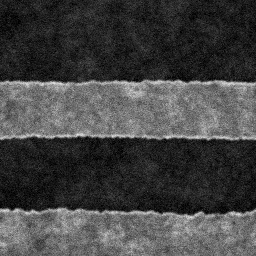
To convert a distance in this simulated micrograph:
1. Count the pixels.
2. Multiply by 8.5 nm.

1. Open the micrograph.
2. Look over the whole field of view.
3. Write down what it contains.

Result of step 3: one or a few lines or trenches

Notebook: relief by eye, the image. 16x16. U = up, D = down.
DDDDDDDDDDDDDDDD
DDDDDDDDDDDDDDDD
DDDDDDDDDDDDDDDD
DDDDDDDDDDDDDDDD
DDDDDDDDDDDDDDDD
UUUUUUUUUUUUUUUU
UUUUUUUUUUUUUUUU
UUUUUUUUUUUUUUUU
UUUUDDUUUUUUUUUU
DDDDDDDDDDDDDDDD
DDDDDDDDDDDDDDDD
DDDDDDDDDDDDDDDD
DDDDDDDDDDDDDDDD
UUUUUUUUUUUDUUUU
UUUUUUUUUUUUUUUU
UUUUUUUUUUUUUUUU